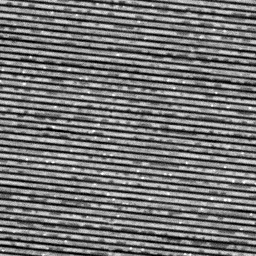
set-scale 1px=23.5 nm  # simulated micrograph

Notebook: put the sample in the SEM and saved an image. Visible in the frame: parallel lines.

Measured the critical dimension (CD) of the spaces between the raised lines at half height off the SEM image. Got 3.48 px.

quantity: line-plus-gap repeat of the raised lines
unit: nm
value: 156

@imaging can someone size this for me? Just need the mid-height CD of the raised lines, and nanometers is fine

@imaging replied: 81.8